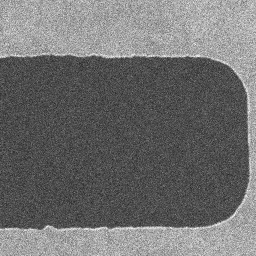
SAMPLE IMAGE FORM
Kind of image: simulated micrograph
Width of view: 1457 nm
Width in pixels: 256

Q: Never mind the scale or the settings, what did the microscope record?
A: one or a few lines or trenches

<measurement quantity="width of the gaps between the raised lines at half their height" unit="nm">979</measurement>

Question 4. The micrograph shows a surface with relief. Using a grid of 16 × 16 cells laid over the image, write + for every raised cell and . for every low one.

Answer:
++++++++++++++++
++++++++++++++++
++++++++++++++++
++.....+..++++++
...............+
...............+
................
................
................
................
................
................
...............+
..............++
++++++++++++++++
++++++++++++++++